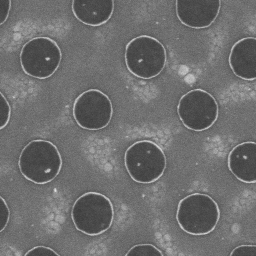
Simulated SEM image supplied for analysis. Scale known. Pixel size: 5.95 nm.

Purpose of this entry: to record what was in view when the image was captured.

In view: a regular array of raised bodies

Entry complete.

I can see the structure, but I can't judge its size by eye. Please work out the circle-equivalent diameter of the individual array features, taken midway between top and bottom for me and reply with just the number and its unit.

247 nm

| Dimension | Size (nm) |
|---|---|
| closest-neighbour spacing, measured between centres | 440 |